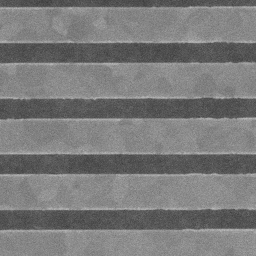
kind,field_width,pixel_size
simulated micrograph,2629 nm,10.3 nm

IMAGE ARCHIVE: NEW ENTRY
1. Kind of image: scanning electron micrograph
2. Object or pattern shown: lines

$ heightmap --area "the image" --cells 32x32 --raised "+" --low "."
................................
++++++++++++++++++++++++++++++++
++++++++++++++++++++++++++++++++
++++++++++++++++++++++++++++++++
++++++++++++++++++++++++++++++++
................................
................................
................................
++++++++++++++++++++++++++++++++
++++++++++++++++++++++++++++++++
++++++++++++++++++++++++++++++++
++++++++++++++++++++++++++++++++
................................
................................
................................
++++++++++++++++++++++++++++++++
++++++++++++++++++++++++++++++++
++++++++++++++++++++++++++++++++
++++++++++++++++++++++++++++++++
................................
................................
................................
++++++++++++++++++++++++++++++++
++++++++++++++++++++++++++++++++
++++++++++++++++++++++++++++++++
++++++++++++++++++++++++++++++++
................................
................................
................................
++++++++++++++++++++++++++++++++
++++++++++++++++++++++++++++++++
++++++++++++++++++++++++++++++++